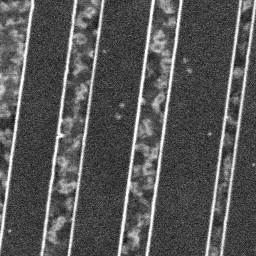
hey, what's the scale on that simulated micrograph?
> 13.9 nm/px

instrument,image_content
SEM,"one or a few lines or trenches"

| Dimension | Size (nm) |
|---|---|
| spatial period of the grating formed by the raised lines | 1090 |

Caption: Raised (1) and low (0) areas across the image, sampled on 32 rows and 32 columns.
00001111100001111110000111111100
00001111100001111110001111111100
00001111100001111110001111111100
00001111100011111110001111111101
00001111100011111110001111111001
00011111100011111100001111111001
00011111100011111100001111111001
00011111100011111100001111111001
00011111000011111100001111111001
00011111000011111100011111111001
00011111000111111100011111111011
00011111000111111100011111111011
00111111000111111100011111110011
00111111000111111000011111110011
00111111000111111000011111110011
00111110000111111000011111110011
00111110000111111000111111110011
00111110001111111000111111110011
00111110001111111000111111110111
01111110001111111000111111100111
01111110001111110000111111100111
01111110001111110000111111100111
01111100001111110000111111100111
01111100001111110001111111100111
01111100001111110001111111100111
01111100011111110001111111101111
11111100011111110001111111101111
11111100011111100001111111001111
11111100011111100001111111001111
11111100011111100001111111001111
11111000011111100001111111001111
11111000011111100011111111001111